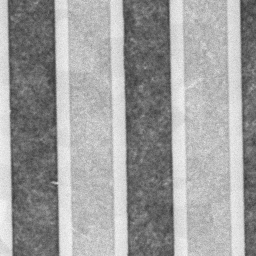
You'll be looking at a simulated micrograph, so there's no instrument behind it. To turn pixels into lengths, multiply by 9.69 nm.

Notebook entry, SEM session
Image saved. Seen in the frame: one or a few lines or trenches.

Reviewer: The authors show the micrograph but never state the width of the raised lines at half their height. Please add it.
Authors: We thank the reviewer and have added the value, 530 nm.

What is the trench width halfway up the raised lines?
598 nanometres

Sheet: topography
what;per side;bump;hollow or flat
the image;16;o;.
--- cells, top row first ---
....ooo....oooo.
....ooo....oooo.
....ooo....oooo.
....ooo....oooo.
....ooo....oooo.
....ooo....oooo.
....ooo....oooo.
....ooo....oooo.
....ooo....oooo.
....ooo....oooo.
....ooo....oooo.
....ooo....oooo.
....ooo....oooo.
....ooo....oooo.
....ooo....oooo.
....ooo....oooo.